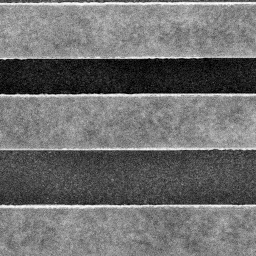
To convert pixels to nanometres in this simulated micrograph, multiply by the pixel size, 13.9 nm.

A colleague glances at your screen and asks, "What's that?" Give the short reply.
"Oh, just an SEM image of lines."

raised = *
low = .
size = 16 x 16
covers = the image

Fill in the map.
****************
****************
****************
****************
................
................
****************
****************
****************
................
................
................
................
****************
****************
****************